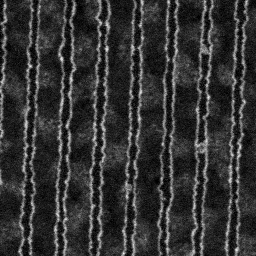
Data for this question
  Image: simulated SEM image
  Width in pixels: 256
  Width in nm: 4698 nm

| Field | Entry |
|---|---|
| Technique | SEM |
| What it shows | parallel lines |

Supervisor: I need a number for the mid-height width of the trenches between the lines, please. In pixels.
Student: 8.24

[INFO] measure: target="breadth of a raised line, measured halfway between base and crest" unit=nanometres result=481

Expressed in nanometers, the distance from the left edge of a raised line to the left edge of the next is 629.